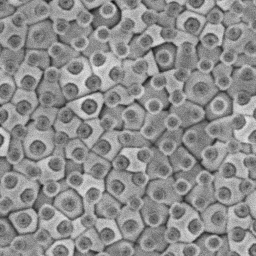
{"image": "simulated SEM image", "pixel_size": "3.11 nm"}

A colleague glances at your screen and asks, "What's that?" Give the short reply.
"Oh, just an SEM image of a regular array of ring-shaped raised bodies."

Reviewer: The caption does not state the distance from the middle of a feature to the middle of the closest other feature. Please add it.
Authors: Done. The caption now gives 23.4 px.